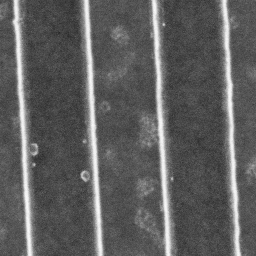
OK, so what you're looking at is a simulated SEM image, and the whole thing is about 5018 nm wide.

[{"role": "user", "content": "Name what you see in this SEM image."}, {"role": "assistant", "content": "one or a few lines or trenches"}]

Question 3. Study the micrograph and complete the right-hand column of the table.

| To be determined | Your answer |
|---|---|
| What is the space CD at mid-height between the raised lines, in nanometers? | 1370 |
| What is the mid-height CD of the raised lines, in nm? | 1340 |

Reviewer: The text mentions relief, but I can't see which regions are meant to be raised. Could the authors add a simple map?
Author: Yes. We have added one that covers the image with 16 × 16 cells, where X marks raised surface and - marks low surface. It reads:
X----XXXXX----XX
X----XXXXX----XX
X-----XXXX----XX
X-----XXXX----XX
X-----XXXX----XX
X-----XXXX----XX
X-----XXXX----XX
X-----XXXX----XX
X-----XXXX----XX
XX----XXXX-----X
XX----XXXX-----X
XX----XXXX-----X
XX----XXXX-----X
XX----XXXX-----X
XX----XXXX-----X
XX----XXXXX----X